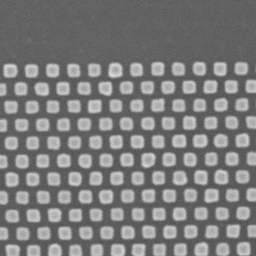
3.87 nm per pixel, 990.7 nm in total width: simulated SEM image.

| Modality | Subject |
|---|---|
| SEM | a regular array of raised bodies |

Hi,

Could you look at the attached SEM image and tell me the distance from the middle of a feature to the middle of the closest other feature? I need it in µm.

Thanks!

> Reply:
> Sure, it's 0.0788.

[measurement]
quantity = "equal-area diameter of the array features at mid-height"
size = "13.3 px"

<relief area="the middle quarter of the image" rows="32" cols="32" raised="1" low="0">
01110011100111000110001110011100
01110011100111000110001110011100
01110011100111000110001110011100
00000000000000000000000000000000
00000000000000011000000000000011
10001100011100111000110001100011
10001100011100111000110001100011
10001000001100000000000001000000
00000000000000000000000000000000
01110011100011000111001110011100
01110011100011000111001110011100
01110011100011000111001110001100
00000000000000000000000000000000
00000000000000000000000001100011
10001100011100111000110001110011
10001100011100111000110001110011
10000000000000000000000000000000
00000000000000000000000000000000
01110011100111000111001110011100
01110011100111000111001110011100
01110001100011000111001110011100
00000000000000000000000000000000
00000000000000000000010001100011
10001110011100111000111001110011
10001110011100111001110001110011
00001110000000000001100000000000
00000000000000000000000000000000
01110001100011100111001110011100
01110001100011100111001110011110
01110001100011100111001110011110
00000000000000000000000000000000
00000000000000000000111000000000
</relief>